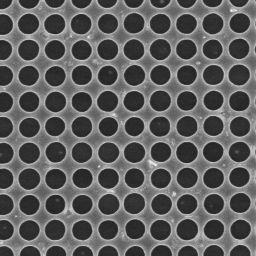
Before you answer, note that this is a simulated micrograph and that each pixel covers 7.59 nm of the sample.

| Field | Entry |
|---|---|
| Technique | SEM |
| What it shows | a regular array of holes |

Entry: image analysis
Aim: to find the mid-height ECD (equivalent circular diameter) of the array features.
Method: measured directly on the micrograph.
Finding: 157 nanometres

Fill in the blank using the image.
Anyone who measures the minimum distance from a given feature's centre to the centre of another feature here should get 0.194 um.